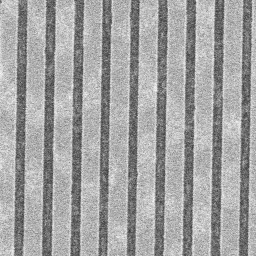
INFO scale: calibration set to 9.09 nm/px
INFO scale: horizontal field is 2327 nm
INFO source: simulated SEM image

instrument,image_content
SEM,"parallel lines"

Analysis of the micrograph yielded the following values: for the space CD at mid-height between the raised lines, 0.0909 um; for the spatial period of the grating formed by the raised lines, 256 nm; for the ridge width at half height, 166 nm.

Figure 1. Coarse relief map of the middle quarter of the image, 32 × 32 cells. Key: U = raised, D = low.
UUDDDUUUUDDDUUUUDDDUUUUDDDUUUUDD
UUDDDUUUUDDDUUUUDDDUUUUDDDUUUUDD
UUDDDUUUUDDDUUUUDDDUUUUDDDUUUUDD
UUDDDUUUUDDDUUUUDDDUUUUDDDUUUUDD
UUDDDUUUUDDDUUUUDDDUUUUDDDUUUUDD
UUDDDUUUUDDDUUUUDDDUUUUDDDUUUUDD
UUDDDUUUUDDDUUUUDDDUUUUDDDUUUUDD
UUDDDUUUUDDDUUUUDDDUUUUDDDUUUUDD
UUDDDUUUUDDDUUUUDDDUUUUDDDUUUUDD
UUDDDUUUUDDDUUUUDDDUUUUDDDUUUUDD
UUDDDUUUUDDDUUUUDDDUUUUDDDUUUUDD
UUDDDUUUUDDDUUUUDDDUUUUDDDUUUUDD
UUDDDUUUUDDDUUUUDDDUUUUDDDUUUUDD
UUDDDUUUUDDDUUUUDDDUUUUDDDUUUUDD
UUDDDUUUUDDDUUUUDDDUUUUDDDUUUUDD
UUDDDUUUUDDDUUUUDDDUUUUDDDUUUUDD
UUDDDUUUUDDUUUUUDDDUUUUDDDUUUUDD
UUDDDUUUUDDUUUUUDDDUUUUDDDUUUUDD
UUDDDUUUUDDUUUUUDDDUUUUDDDUUUUDD
UUDDDUUUUDDUUUUUDDUUUUUDDDUUUUDD
UUDDDUUUUDDUUUUUDDUUUUUDDDUUUUDD
UUDDDUUUUDDUUUUUDDUUUUUDDDUUUUDD
UUDDDUUUUDDUUUUUDDUUUUUDDDUUUUDD
UUDDDUUUUDDUUUUUDDUUUUUDDUUUUUDD
UUDDDUUUUDDUUUUUDDUUUUUDDUUUUUDD
UUDDDUUUUDDUUUUUDDUUUUUDDUUUUUDD
UUDDUUUUUDDUUUUUDDUUUUUDDUUUUUDD
UUDDUUUUUDDUUUUUDDDUUUUDDUUUUUDD
UUDDUUUUUDDUUUUUDDUUUUUDDUUUUUDD
UUDDUUUUUDDUUUUUDDUUUUUDDUUUUUDD
UUDDUUUUUDDUUUUUDDUUUUUDDUUUUUDD
UUDDUUUUUDDUUUUUDDUUUUUDDUUUUUDD